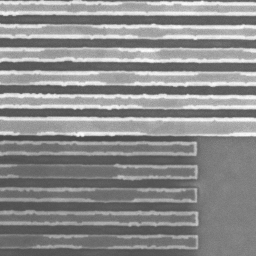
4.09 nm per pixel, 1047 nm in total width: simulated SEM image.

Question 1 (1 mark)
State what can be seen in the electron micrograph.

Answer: parallel lines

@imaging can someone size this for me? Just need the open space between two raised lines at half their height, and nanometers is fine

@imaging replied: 38.4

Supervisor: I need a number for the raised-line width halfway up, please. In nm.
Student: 57.3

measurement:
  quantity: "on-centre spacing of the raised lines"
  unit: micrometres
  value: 0.0958